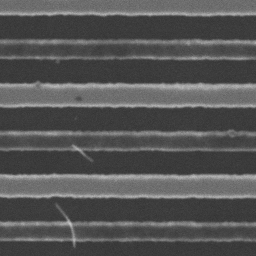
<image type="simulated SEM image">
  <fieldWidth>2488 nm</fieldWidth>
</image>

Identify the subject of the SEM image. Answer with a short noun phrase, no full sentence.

lines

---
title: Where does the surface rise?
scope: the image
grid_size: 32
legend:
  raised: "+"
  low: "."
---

++++++++++++++++++++++++++++++++
++++++++++++++++++++++++++++++++
................................
................................
................................
++++++++++++++++++++++++++++++++
++++++++++++++++++++++++++++++++
................................
................................
................................
....++..+..+.+...........+......
++++++++++++++++++++++++++++++++
++++++++++++++++++++++++++++++++
................................
................................
................................
............................++..
++++++++++++++++++++++++++++++++
++++++++++++++++++++++++++++++++
................................
................................
................................
++++++++++++++++++++++++++++++++
++++++++++++++++++++++++++++++++
++++++++++++++++++++++++++++++++
................................
................................
................................
++++++++++++++++++++++++++++++++
++++++++++++++++++++++++++++++++
................................
................................